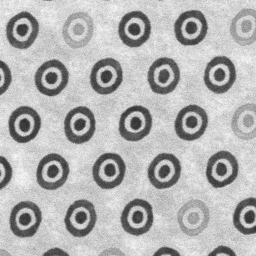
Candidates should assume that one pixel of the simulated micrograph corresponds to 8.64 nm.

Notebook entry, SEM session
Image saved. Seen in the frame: a regular array of ring-shaped grooves with a dot in the middle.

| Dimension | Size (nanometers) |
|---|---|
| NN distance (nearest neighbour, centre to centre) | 469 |